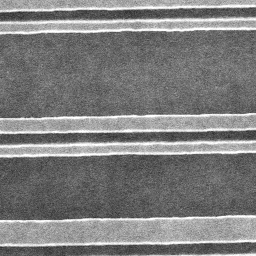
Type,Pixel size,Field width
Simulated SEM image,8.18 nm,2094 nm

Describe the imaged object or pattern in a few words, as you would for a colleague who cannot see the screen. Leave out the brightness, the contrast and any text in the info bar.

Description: lines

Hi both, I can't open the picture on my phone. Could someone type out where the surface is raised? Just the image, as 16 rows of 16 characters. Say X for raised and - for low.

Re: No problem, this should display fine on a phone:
XXXXXXXXXXXXXXXX
XXXXXXXXXXXXXXXX
----------------
----------------
----------------
----------------
----------------
XXXXXXXXXXXXXXXX
XXXXXXXXXXXXXXXX
XXXXXXXXXXXXXXX-
----------------
----------------
----------------
----------------
XXXXXXXXXXXXXXXX
XXXXXXXXXXXXXXXX